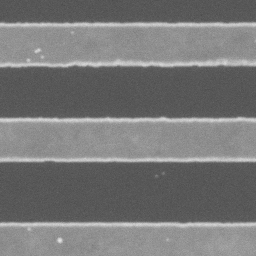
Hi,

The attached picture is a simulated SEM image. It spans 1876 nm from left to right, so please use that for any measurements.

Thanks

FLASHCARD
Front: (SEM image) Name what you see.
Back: lines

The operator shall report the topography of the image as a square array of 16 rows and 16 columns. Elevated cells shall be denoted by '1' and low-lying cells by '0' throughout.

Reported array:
0000000000000000
0000000000000000
1111111111111111
1111111111111111
0000000000000000
0000000000000000
0000000000000000
1111111111111111
1111111111111111
1111111111111111
0000000000000000
0000000000000000
0000000000000000
0000000000000000
1111111111111111
1111111111111111